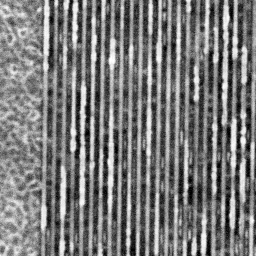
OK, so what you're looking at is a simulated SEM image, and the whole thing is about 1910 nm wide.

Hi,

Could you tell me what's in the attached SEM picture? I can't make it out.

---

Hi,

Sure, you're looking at parallel lines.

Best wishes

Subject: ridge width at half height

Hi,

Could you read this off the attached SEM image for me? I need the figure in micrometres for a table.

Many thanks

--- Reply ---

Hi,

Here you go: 0.0214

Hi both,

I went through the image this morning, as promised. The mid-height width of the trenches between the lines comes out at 49.4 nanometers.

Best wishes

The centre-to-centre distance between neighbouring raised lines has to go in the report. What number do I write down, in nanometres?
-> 70.4